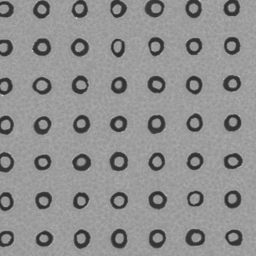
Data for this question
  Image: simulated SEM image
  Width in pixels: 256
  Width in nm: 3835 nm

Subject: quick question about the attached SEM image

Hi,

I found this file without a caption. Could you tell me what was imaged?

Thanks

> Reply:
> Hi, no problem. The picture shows a regular array of ring-shaped grooves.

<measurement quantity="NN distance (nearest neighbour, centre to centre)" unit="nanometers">561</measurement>